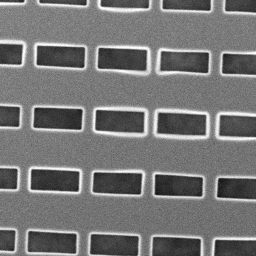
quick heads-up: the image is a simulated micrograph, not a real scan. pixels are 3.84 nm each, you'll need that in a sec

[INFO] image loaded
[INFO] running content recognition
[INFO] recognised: an array of small figures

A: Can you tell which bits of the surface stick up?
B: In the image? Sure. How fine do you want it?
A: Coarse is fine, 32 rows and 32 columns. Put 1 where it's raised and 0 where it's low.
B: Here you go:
11111000000100000001000000110000
11111111111111111111111111111000
11111111111111111111111111111111
11111111111111111111111111111111
11111111111111111111111111111111
00011111111111111111111111111111
00010000000100000011000000111111
00010000000100000001000000110000
11111111001100000001000000110000
11111111111111111111111111111111
11111111111111111111111111111111
11111111111111111111111111111111
11111111111111111111111111111111
00111000011111111111111111111111
00010000001100000011000000110000
00110000001100000010000000100000
11111111111110000011000000100000
11111111111111111111111111111111
11111111111111111111111111111111
11111111111111111111111111111111
11111111111111111111111111111111
00110000001111010111111111111111
00110000001100000010000001100000
00110000001100000010000001100000
11111111111111111111000001100000
11111111111111111111111111111111
11111111111111111111111111111111
11111111111111111111111111111111
11111111111111111111111111111111
00100000001000000111111111111111
00100000001000000110000001100000
11110000011000000110000001100000